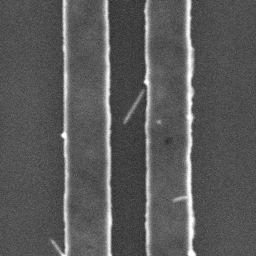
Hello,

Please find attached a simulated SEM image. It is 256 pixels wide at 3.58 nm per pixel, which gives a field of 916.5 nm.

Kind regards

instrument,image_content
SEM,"lines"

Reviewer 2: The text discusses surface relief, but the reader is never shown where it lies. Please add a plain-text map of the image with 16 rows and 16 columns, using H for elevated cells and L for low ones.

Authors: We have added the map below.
LLLLHHHLLHHHLLLL
LLLLHHHLLHHHLLLL
LLLLHHHLLHHHLLLL
LLLLHHHLLHHHLLLL
LLLLHHHLLHHHLLLL
LLLLHHHLLHHHLLLL
LLLLHHHLLHHHLLLL
LLLLHHHLLHHHLLLL
LLLLHHHLLHHHLLLL
LLLLHHHLLHHHLLLL
LLLLHHHLLHHHLLLL
LLLLHHHLLHHHLLLL
LLLLHHHLLHHHLLLL
LLLLHHHLLHHHLLLL
LLLLHHHLLHHHLLLL
LLLLHHHLLHHHLLLL